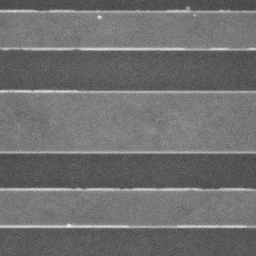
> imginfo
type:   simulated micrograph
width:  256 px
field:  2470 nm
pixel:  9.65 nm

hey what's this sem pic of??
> lines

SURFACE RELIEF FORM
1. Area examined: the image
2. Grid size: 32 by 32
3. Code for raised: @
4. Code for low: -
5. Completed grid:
--------------------------------
@@@@@@@@@@@@@@@@@@@@@@@@@@@@@@@@
@@@@@@@@@@@@@@@@@@@@@@@@@@@@@@@@
@@@@@@@@@@@@@@@@@@@@@@@@@@@@@@@@
@@@@@@@@@@@@@@@@@@@@@@@@@@@@@@@@
@@@@@@@@@@@@@@@@@@@@@@@@@@@@@@@@
--------------------------------
--------------------------------
--------------------------------
--------------------------------
--------------------------------
@@@@@@@@@@@@@@@@@@@@@@@@@@@@@@@@
@@@@@@@@@@@@@@@@@@@@@@@@@@@@@@@@
@@@@@@@@@@@@@@@@@@@@@@@@@@@@@@@@
@@@@@@@@@@@@@@@@@@@@@@@@@@@@@@@@
@@@@@@@@@@@@@@@@@@@@@@@@@@@@@@@@
@@@@@@@@@@@@@@@@@@@@@@@@@@@@@@@@
@@@@@@@@@@@@@@@@@@@@@@@@@@@@@@@@
@@@@@@@@@@@@@@@@@@@@@@@@@@@@@@@@
--------------------------------
--------------------------------
--------------------------------
--------------------------------
--------------------------------
@@@@@@@@@@@@@@@@@@@@@@@@@@@@@@@@
@@@@@@@@@@@@@@@@@@@@@@@@@@@@@@@@
@@@@@@@@@@@@@@@@@@@@@@@@@@@@@@@@
@@@@@@@@@@@@@@@@@@@@@@@@@@@@@@@@
--------------------------------
--------------------------------
--------------------------------
--------------------------------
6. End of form